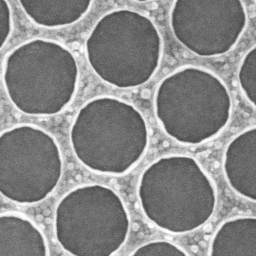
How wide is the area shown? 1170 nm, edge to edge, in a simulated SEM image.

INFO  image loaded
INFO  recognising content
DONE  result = holes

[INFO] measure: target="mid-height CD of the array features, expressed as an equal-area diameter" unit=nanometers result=346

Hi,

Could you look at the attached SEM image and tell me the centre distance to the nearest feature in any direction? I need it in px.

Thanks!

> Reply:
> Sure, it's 88.3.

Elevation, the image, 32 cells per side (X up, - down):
-XX--------XXXXXXXXXXX--------XX
-XX--------XXX---XXXX----------X
-XXX------XXX------XX----------X
-XXXXXXXXXXX-------XXX---------X
-XXXXXXXXXX---------XX--------XX
XXX----XXXX---------XXX------XXX
XX-------XX---------XXXX----XXX-
X--------XX---------XXXXXXXXXX--
X---------XX--------XXX--XXXXX--
----------XX-------XX------XXX--
X--------XXXXX----XX--------XX--
X--------XXXXXXXXXXX--------XX--
X--------XXX---XXXX----------XX-
XX------XX-------XX----------XXX
XXXXXXXXXX--------XX---------XXX
XXXXXXXXX---------XX--------XXXX
X-----XXX---------XXX------XXXX-
-------XX---------XXXX----XXX---
-------XX---------XXXXXXXXXX----
--------XX--------XXXXXXXXXX----
--------XXX------XX------XXX----
--------XXXX----XX-------XXX----
-------XXXXXXXXXXX--------XX----
-------XXX---XXXX----------XX---
X-----XX-------XX----------XXXX-
XXXXXXX--------XXX---------XXXXX
XXXXXXX---------XX---------XXXXX
---XXXX---------XXX-------XXX---
-----XX---------XXXX-----XXX----
-----XX---------XXXXXXXXXXX-----
------XX-------XXX----XXXX------
------XXX-----XXX------XXX------